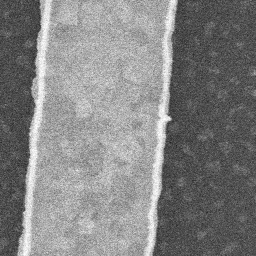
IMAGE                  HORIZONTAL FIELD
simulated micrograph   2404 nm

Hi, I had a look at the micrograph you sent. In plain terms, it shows one or a few lines or trenches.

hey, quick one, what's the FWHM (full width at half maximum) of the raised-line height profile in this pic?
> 1160 nanometres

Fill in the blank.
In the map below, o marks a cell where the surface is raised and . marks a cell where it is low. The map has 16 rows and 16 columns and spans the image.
...oooooooo.....
...oooooooo.....
...ooooooo......
...ooooooo......
...ooooooo......
...ooooooo......
..oooooooo......
..oooooooo......
..oooooooo......
..oooooooo......
..oooooooo......
..oooooooo......
..oooooooo......
..ooooooo.......
..ooooooo.......
..ooooooo.......